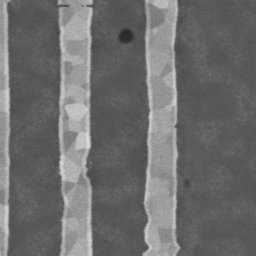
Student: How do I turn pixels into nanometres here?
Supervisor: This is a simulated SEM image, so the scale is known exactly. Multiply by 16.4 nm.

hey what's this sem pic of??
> one or a few lines or trenches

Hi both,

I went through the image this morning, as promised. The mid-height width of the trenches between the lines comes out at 930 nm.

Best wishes